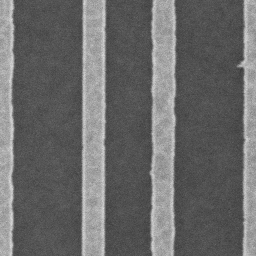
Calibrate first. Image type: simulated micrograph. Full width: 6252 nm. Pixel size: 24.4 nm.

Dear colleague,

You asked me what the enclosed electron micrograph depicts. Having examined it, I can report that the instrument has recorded one or a few lines or trenches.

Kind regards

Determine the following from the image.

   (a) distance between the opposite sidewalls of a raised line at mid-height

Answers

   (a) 0.482 microns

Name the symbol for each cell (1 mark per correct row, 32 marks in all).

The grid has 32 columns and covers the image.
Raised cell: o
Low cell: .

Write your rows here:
o..........oo......ooo.........o
o..........oo......ooo.........o
o..........oo......ooo.........o
o..........oo......ooo.........o
oo.........oo......ooo.........o
o..........oo......ooo.........o
o..........oo......ooo.........o
o..........oo......ooo.........o
o..........oo......ooo........oo
o..........oo......ooo.........o
o.........ooo......ooo.........o
o.........ooo......ooo.........o
o.........ooo......ooo.........o
o..........oo......ooo.........o
o..........oo......ooo.........o
o..........oo......ooo.........o
oo.........oo......ooo.........o
o..........oo......ooo.........o
o..........oo......ooo.........o
oo........ooo......ooo.........o
oo.........oo......ooo.........o
o..........oo......ooo.........o
o..........oo......ooo.........o
o.........ooo......ooo.........o
o..........oo......ooo.........o
o..........oo......oo..........o
o..........oo......oo..........o
o..........oo......ooo.........o
o.........ooo......ooo.........o
o..........oo......ooo.........o
o.........ooo......oo..........o
o.........ooo......oo..........o